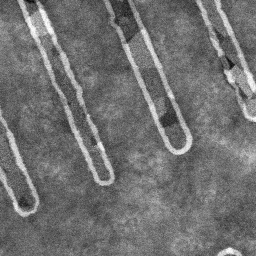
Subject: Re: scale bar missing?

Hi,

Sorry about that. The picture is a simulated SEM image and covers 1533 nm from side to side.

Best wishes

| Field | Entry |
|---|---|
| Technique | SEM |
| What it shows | one or a few lines or trenches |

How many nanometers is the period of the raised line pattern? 489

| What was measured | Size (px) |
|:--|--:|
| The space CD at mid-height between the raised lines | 61.6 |